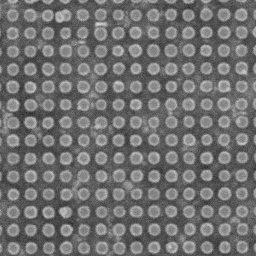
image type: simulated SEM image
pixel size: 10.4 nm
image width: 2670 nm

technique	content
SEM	a regular array of raised bodies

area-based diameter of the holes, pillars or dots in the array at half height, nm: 115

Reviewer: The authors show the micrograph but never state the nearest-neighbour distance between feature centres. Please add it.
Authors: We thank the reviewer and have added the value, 181 nanometers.